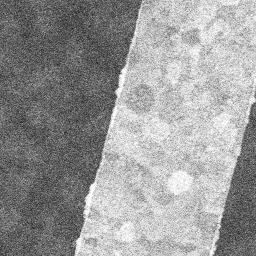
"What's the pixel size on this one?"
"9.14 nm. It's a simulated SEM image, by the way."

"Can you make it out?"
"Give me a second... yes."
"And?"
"one or a few lines or trenches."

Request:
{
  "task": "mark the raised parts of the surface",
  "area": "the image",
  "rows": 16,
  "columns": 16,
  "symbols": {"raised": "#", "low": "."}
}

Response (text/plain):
.........#######
.........#######
........########
........########
........########
.......#########
.......#########
.......########.
.......########.
......#########.
......#########.
......########..
.....#########..
.....#########..
.....#########..
.....########...